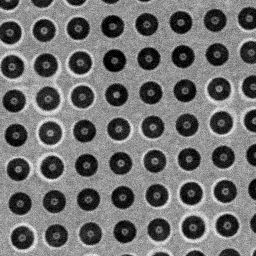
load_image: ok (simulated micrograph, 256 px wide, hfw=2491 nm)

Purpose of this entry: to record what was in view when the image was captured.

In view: an array of small figures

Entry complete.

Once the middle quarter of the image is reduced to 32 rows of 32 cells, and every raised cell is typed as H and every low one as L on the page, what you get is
HLLLLLLHHHLLLLLHHHHLLLLLHHHHLLLL
HLLLLLLHHHHLLLLHHHHHLLHHHHHHHHHH
HHLLLLHHHHHHHHHHHHHHHHHHHHHHHHHH
HHHHHHHHHHHHHHHHHHHHHHHHHHHHHHHH
HHHHHHHHHHHHHHHHHHHHHLLHHHHHLLLL
HHHLLLHHHHHLLLLHHHHLLLLLHHHHLLLL
HHLLLLLHHHLLLLLLHHHLLLLLLHHLLLHL
HLLLLLLLHHLLLHLLHHHLLHLLLHHLLLLL
HLLLHLLLHHLLLLLLHHHLLLLLHHHHLLLL
HLLLLLLLHHHLLLLLHHHHLLLLHHHHHLLH
HHLLLLLHHHHHLLHHHHHHHHHHHHHHHHHH
HHHHHHHHHHHHHHHHHHHHHHHHHHHHHHHH
HHHHHHHHHHHHHHHHHHHHHHHHHHHHHHLL
HHHHHHHHHHHHHLLHHHHHLLLLHHHHLLLL
HHHLLLLHHHHLLLLLHHHLLLLLLHHHLLLL
HHLLLLLLHHHLLLLLLHHLLLHLLHHHLLHL
HHLLLHLLHHHLLHLLLHHLLLLLLHHHLLLL
HHLLLLLLHHHLLLLLLHHLLLLLLHHHHLLL
HHHLLLLLHHHLLLLLHHHHLLLLHHHHHHHH
HHHHLLHHHHHHHHHHHHHHHHHHHHHHHHHH
HHHHHHHHHHHHHHHHHHHHHHHHHHHHHHHH
HHHHHHHHHHHHHHHHHHHHHLLLHHHHHLLL
HHHHHLLHHHHHLLLLHHHHLLLLLHHHLLLL
HHHLLLLLHHHHLLLLLHHHLLLLLLHHLLLH
HHHLLLLLLHHLLLHLLHHHLLHLLLHHLLLL
HHHLLHLLLHHLLLLLLHHHLLLLLHHHHLLL
HHHLLLLLHHHHLLLLLHHHHLLLLHHHHHLL
HHHHLLLLHHHHHLLHHHHHHHHHHHHHHHHH
HHHHHHHHHHHHHHHHHHHHHHHHHHHHHHHH
HHHHHHHHHHHHHHHHHHHHHHHHHHHHHHHL
HHHHHHHHHHHHHHLLHHHHHLLLLHHHHLLL
HHHHLLLLHHHHLLLLLHHHLLLLLLHHHLLL